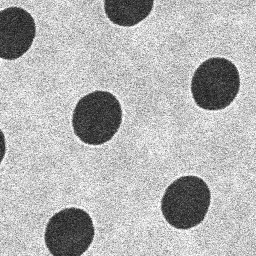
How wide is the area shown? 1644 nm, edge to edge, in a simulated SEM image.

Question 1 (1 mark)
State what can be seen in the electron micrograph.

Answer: holes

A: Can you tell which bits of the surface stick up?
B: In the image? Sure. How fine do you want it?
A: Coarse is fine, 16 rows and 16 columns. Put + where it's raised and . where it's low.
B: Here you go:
.++++++...++++++
..+++++..+++++++
..++++++++++++++
.+++++++++++++++
++++++++++++...+
++++++++++++...+
+++++..+++++..++
+++++...++++++++
+++++..+++++++++
++++++++++++++++
++++++++++++++++
+++++++++++..+++
++++++++++...+++
+++...++++...+++
+++...++++++++++
+++...++++++++++